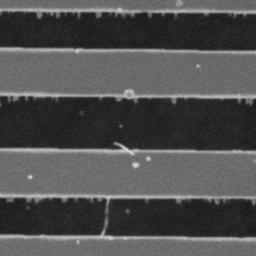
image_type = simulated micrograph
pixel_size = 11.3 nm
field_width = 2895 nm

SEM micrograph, lines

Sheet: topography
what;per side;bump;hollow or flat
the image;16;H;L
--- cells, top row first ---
HHHHHHHHHHHHHHHH
LLLLLLLLLLLLLLLL
LLLLLLLLLLLLLLLL
HHHHHHHHHHHHHHHH
HHHHHHHHHHHHHHHH
HHHHHHHHHHHHHHHH
LLLLLLLLLLLLLLLL
LLLLLLLLLLLLLLLL
LLLLLLLLLLLLLLLL
HHHHHHHHHHHHHHHH
HHHHHHHHHHHHHHHH
HHHHHHHHHHHHHHHH
LLLLLLLLLLLLLLLL
LLLLLLLLLLLLLLLL
LLLLLLLLLLLLLLLL
HHHHHHHHHHHHHHHH